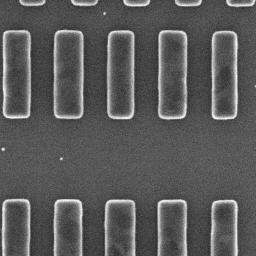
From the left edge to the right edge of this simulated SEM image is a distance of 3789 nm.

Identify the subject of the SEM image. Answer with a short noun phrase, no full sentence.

wiring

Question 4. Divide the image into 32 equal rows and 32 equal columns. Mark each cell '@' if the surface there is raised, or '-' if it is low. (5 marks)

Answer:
---@@----@@@----@@----@@@----@@@
--------------------------------
--------------------------------
--------------------------------
@@@@---@@@----@@@---@@@----@@@--
@@@@---@@@---@@@@---@@@----@@@--
@@@@---@@@---@@@@---@@@----@@@--
@@@@---@@@---@@@@---@@@----@@@--
-@@@---@@@---@@@@---@@@----@@@--
@@@@---@@@---@@@@---@@@----@@@--
@@@@---@@@---@@@@---@@@----@@@--
@@@@---@@@---@@@@---@@@----@@@--
@@@@---@@@---@@@@---@@@----@@@--
@@@@---@@@---@@@@---@@@----@@@--
-@@@---@@@----@@----@@@----@@---
--------------------------------
--------------------------------
--------------------------------
--------------------------------
--------------------------------
--------------------------------
--------------------------------
--------------------------------
--------------------------------
--------------------------------
@@@@---@@@---@@@@---@@@----@@@--
@@@@---@@@---@@@@---@@@----@@@--
@@@@---@@@---@@@@---@@@----@@@--
@@@@---@@@---@@@@---@@@----@@@--
@@@@---@@@---@@@@---@@@---@@@@--
@@@@---@@@---@@@@---@@@---@@@@--
@@@@---@@@---@@@@---@@@---@@@@--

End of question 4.